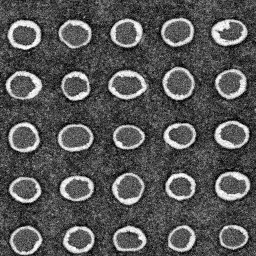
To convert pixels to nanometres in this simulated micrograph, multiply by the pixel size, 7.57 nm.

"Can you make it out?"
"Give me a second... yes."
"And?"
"a regular array of raised bodies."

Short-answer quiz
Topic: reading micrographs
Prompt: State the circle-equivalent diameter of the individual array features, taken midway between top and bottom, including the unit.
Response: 213 nanometers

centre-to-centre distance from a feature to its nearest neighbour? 51 px